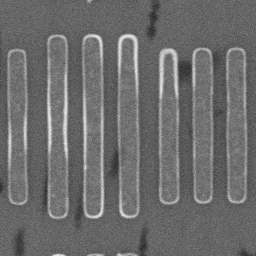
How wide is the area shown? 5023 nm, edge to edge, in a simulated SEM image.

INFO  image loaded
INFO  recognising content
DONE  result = groups of lines, slits or small figures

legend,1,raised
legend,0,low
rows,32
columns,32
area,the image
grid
00000000000000000000000000000000
00000000000000000000000000000000
00000000000000000000000000000000
00000000000000000000000000000000
00000001000100000000000000000000
00000011001110011000000000000000
01100011001110011000000011000100
01100011001110011000110011001110
01100011001110011000110011001110
01100011001110011000110011001110
01100011001110011000110011001110
01100011000110011000110011000110
01100011000110011000110011000110
01100011000110011000110011000110
01100011000110011000110011000110
01100011000110011000110011001110
01100011000110011000110011001110
01100011000110011000110011001110
01100011000110011000110011001110
01100011000110011000110011000110
01100011000110011000110011000110
01100011000110011000110011000110
01100011000110011000110011000110
01100011000110011000110011000110
01100011000110011000110011000110
00000011000110011000000000000000
00000011000110011000000000000000
00000000000000000000000000000000
00000000000000000000000000000000
00000000000000000000000000000000
00000000000000000000000000000000
00000000000000000000000000000000